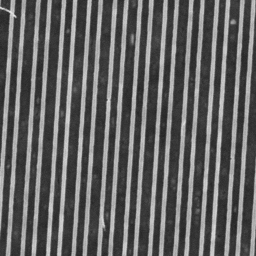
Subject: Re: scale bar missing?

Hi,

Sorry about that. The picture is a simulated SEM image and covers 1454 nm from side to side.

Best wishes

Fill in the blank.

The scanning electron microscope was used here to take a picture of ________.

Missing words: parallel lines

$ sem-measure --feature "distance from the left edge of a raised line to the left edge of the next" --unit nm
72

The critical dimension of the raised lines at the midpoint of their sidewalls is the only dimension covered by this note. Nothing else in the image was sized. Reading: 0.0198 µm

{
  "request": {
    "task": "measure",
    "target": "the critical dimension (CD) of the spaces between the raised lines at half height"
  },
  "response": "0.0446 um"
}